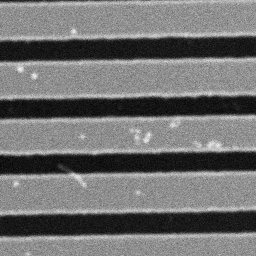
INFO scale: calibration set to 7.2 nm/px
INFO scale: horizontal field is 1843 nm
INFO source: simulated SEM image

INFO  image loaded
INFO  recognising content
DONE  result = lines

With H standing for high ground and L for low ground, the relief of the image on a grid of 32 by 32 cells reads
HHHHHHHHHHHHHHHHHHHHHHHHHHHHHHHH
HHHHHHHHHHHHHHHHHHHHHHHHHHHHHHHH
HHHHHHHHHHHHHHHHHHHHHHHHHHHHHHHH
HHHHHHHHHHHHHHHHHHHHHHHHHHHHHHHH
HHHHHHHHHHHHHHHHHHHHHLHHHLLLLLLL
LLLLLLLLLLLLLLLLLLLLLLLLLLLLLLLL
LLLLLLLLLLLLLLLLLLLLLLLLLLLLLLLL
LLLLLLLLLLLLLLLLLLLLLLHHHHHHHHHH
HHHHHHHHHHHHHHHHHHHHHHHHHHHHHHHH
HHHHHHHHHHHHHHHHHHHHHHHHHHHHHHHH
HHHHHHHHHHHHHHHHHHHHHHHHHHHHHHHH
HHHHHHHHHHHHHHHHHHHHHHHHHHHHHHHH
LLLLLLLLLLLLLLLLLLLLLLLLLLLLLLLL
LLLLLLLLLLLLLLLLLLLLLLLLLLLLLLLL
LLLLLLLLLLLLLLLLLLLLLLLLLLLLLLLH
HHHHHHHHHHHHHHHHHHHHHHHHHHHHHHHH
HHHHHHHHHHHHHHHHHHHHHHHHHHHHHHHH
HHHHHHHHHHHHHHHHHHHHHHHHHHHHHHHH
HHHHHHHHHHHHHHHHHHHHHHHHHHHHHHHH
LLLLLLLLLLLLLLLLLLLLLLLLLLLLLLLL
LLLLLLLLLLLLLLLLLLLLLLLLLLLLLLLL
LLLLLLLLLLLLLLLLLLLLLLLLLLLLLLLL
HHHHHHHHHHHHHHHHHHHHHHHHHHHHHHHH
HHHHHHHHHHHHHHHHHHHHHHHHHHHHHHHH
HHHHHHHHHHHHHHHHHHHHHHHHHHHHHHHH
HHHHHHHHHHHHHHHHHHHHHHHHHHHHHHHH
HHHHHHHHHHHHHHHHLLHLLLLLLLLLLLLL
LLLLLLLLLLLLLLLLLLLLLLLLLLLLLLLL
LLLLLLLLLLLLLLLLLLLLLLLLLLLLLLLL
LLLLLLLLLLHHHHHHHHHHHHHHHHHHHHHH
HHHHHHHHHHHHHHHHHHHHHHHHHHHHHHHH
HHHHHHHHHHHHHHHHHHHHHHHHHHHHHHHH